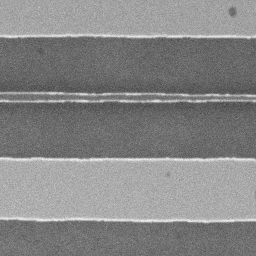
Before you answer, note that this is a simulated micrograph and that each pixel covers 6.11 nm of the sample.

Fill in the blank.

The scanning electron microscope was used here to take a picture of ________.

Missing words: lines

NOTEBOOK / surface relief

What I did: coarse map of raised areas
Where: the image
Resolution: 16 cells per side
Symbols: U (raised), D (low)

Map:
UUUUUUUUUUUUUUUU
UUUUUUUUUUUUUUUU
DDDDDDDDDDDDDDDD
DDDDDDDDDDDDDDDD
DDDDDDDDDDDDDDDD
DDDDDDDDDDDDDDDD
DDDDDDDDDDDDDDDD
DDDDDDDDDDDDDDDD
DDDDDDDDDDDDDDDD
DDDDDDDDDDDDDDDD
UUUUUUUUUUUUUUUU
UUUUUUUUUUUUUUUU
UUUUUUUUUUUUUUUU
UUUUUUUUUUUUUUUU
DDDDDDDDDDDDDDDD
DDDDDDDDDDDDDDDD